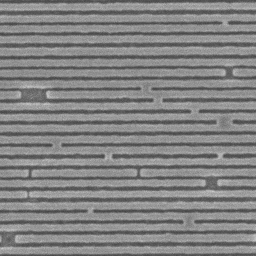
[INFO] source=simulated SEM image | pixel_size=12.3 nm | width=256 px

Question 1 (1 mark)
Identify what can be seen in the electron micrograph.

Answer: parallel lines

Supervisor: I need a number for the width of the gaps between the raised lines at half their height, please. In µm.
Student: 0.0539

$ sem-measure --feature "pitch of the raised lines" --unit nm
136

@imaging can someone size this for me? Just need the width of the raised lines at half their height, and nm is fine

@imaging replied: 84.6